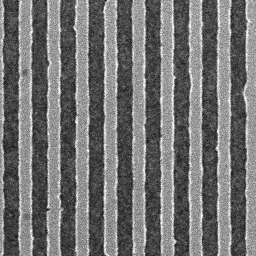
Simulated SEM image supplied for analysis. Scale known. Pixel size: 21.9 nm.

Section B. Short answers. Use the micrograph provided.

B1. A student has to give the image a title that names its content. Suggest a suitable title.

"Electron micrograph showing parallel lines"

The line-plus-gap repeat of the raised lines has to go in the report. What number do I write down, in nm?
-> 621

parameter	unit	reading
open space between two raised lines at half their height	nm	367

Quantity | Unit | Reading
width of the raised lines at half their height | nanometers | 257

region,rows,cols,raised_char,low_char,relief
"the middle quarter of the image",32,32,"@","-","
---@@@----@@@----@@@-----@@----@
---@@@----@@@----@@@-----@@----@
---@@@----@@@----@@@-----@@-----
---@@@----@@@----@@@-----@@-----
---@@@----@@@----@@@-----@@-----
---@@@----@@@----@@@-----@@-----
---@@@----@@@----@@@----@@@-----
---@@@----@@@----@@@-----@@-----
---@@@----@@@----@@@-----@@-----
---@@@----@@@----@@@----@@@-----
---@@@----@@@----@@@-----@@-----
---@@@----@@@----@@@-----@@-----
---@@@----@@@----@@@-----@@----@
---@@@----@@@----@@@-----@@----@
---@@@----@@@----@@@-----@@----@
---@@@----@@@----@@@-----@@----@
---@@@----@@@----@@@-----@@----@
---@@@----@@@----@@@-----@@-----
---@@@----@@@-----@@----@@@-----
---@@@----@@@----@@@----@@@-----
---@@@----@@@----@@@----@@@-----
---@@@----@@@----@@@-----@@-----
---@@@----@@@----@@@-----@@----@
---@@@----@@@----@@@----@@@----@
---@@@----@@@----@@@----@@@----@
---@@@----@@@----@@@----@@@-----
---@@@----@@@----@@@-----@@-----
---@@@----@@@----@@@-----@@----@
---@@@----@@@----@@@-----@@----@
---@@@----@@@----@@@-----@@----@
---@@@----@@@----@@@-----@@----@
---@@@----@@@----@@@-----@@----@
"